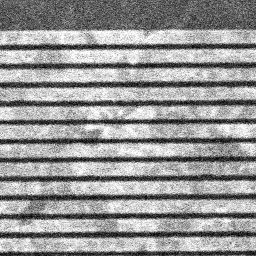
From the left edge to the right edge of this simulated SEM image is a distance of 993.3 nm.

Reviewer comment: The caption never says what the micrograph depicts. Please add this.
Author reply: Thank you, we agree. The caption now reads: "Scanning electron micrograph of parallel lines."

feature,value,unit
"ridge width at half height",46.6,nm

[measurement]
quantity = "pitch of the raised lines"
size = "73.1 nanometers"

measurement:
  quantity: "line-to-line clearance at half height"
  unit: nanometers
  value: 25.2